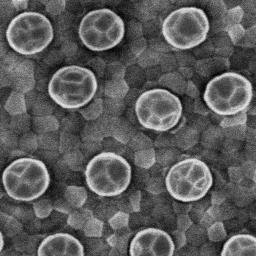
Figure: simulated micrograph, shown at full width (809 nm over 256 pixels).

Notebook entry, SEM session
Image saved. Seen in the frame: a regular array of raised bodies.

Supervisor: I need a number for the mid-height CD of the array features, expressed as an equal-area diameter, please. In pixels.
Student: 42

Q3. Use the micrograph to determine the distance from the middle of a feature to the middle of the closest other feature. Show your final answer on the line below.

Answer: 227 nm